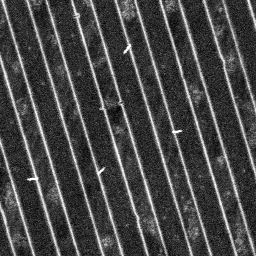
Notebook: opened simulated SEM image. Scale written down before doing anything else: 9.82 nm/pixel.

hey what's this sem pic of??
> parallel lines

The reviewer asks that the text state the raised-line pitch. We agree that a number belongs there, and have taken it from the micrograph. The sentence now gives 416 nm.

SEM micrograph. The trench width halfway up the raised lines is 229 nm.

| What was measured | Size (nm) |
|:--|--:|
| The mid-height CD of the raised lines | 182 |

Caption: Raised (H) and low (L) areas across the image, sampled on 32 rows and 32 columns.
LLLLHHLLLHHHLLLHHLLLHHHLLLHHLLLH
HLLLHHLLLHHHLLLHHLLLHHHLLLHHLLLL
HLLLHHHLLLHHLLLHHHLLLHHLLLHHHLLL
HLLLHHHLLLHHLLLHHHLLLHHLLLLHHLLL
HHLLLHHLLLHHHLLLHHLLLHHHLLLHHLLL
HHLLLHHLLLLHHLLLHHLLLLHHLLLHHHLL
HHLLLHHHLLLHHLLLHHHLLLHHLLLHHHLL
HHHLLLHHLLLHHHLLLHHLLLHHHLLLHHLL
HHHLLLHHLLLHHHLLLHHLLLLHHLLLHHLL
LHHLLLHHHLLLHHLLLHHHLLLHHLLLHHHL
LHHLLLLHHLLLHHHLLLHHLLLHHHLLLHHL
LHHHLLLHHLLLHHHLLLHHLLLHHHLLLHHL
LLHHLLLHHHLLLHHLLLHHHLLLHHLLLHHH
LLHHLLLHHHLLLHHLLLHHHLLLHHLLLHHH
LLHHHLLLHHLLLHHHLLLHHLLLHHHLLLHH
LLLHHLLLHHLLLLHHLLLHHLLLLHHLLLHH
LLLHHLLLHHHLLLHHLLLHHHLLLHHLLLHH
LLLHHHLLLHHLLLHHHLLLHHLLLHHHLLLH
LLLHHHLLLHHLLLHHHLLLHHLLLLHHLLLH
HLLLHHLLLHHHLLLHHLLLHHHLLLHHLLLH
HLLLHHLLLHHHLLLHHLLLLHHLLLHHHLLL
HLLLHHHLLLHHLLLHHHLLLHHLLLHHHLLL
HLLLLHHLLLHHLLLLHHLLLHHHLLLHHLLL
HHLLLHHLLLHHHLLLHHLLLHHHLLLHHLLL
HHLLLHHHLLLHHLLLHHHLLLHHLLLHHHLL
HHLLLLHHLLLHHLLLLHHLLLHHLLLLHHLL
HHHLLLHHLLLHHHLLLHHLLLHHHLLLHHLL
LHHLLLHHHLLLHHLLLHHHLLLHHLLLHHLL
LHHLLLHHHLLLHHLLLHHHLLLHHLLLLHHL
LHHHLLLHHLLLHHHLLLHHLLLHHHLLLHHL
LHHHLLLHHLLLHHHLLLHHLLLLHHLLLHHL
LLHHLLLHHHLLLHHLLLHHHLLLHHLLLHHH